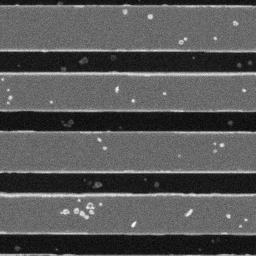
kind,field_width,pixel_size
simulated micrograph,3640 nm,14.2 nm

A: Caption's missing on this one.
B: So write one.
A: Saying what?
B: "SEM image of lines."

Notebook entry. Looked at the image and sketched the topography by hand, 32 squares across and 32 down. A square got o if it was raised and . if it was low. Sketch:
................................
oooooooooooooooooooooooooooooooo
oooooooooooooooooooooooooooooooo
oooooooooooooooooooooooooooooooo
oooooooooooooooooooooooooooooooo
oooooooooooooooooooooooooooooooo
................................
................................
................................
oooooooooooooooooooooooooooooooo
oooooooooooooooooooooooooooooooo
oooooooooooooooooooooooooooooooo
oooooooooooooooooooooooooooooooo
oooooooooooooooooooooooooooooooo
................................
................................
ooooo........o..................
oooooooooooooooooooooooooooooooo
oooooooooooooooooooooooooooooooo
oooooooooooooooooooooooooooooooo
oooooooooooooooooooooooooooooooo
oooooooooooooooooooooooooooooooo
................................
................................
oooooooooooooooooooooooooooooooo
oooooooooooooooooooooooooooooooo
oooooooooooooooooooooooooooooooo
oooooooooooooooooooooooooooooooo
oooooooooooooooooooooooooooooooo
................................
................................
................................